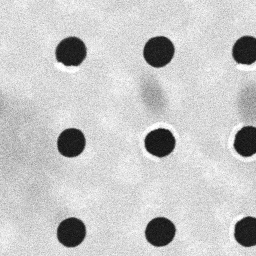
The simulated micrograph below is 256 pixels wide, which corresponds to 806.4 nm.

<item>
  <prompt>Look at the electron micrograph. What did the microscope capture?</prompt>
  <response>holes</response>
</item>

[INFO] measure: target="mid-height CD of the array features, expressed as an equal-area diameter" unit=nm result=92.7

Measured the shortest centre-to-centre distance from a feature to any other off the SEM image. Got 279 nm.